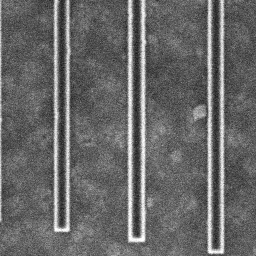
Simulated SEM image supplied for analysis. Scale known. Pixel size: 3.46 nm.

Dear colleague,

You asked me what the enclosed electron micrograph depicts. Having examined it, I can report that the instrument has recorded one or a few lines or trenches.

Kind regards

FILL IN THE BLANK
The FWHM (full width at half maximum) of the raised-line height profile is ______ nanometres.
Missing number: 48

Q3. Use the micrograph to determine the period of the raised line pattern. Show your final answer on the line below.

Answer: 266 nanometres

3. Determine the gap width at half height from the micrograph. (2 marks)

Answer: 225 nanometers